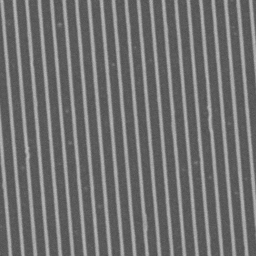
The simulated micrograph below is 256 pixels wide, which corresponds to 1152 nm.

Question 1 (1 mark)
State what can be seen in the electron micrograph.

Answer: parallel lines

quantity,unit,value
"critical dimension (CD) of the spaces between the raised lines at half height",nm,42.5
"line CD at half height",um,0.0118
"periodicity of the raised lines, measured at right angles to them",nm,55.7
